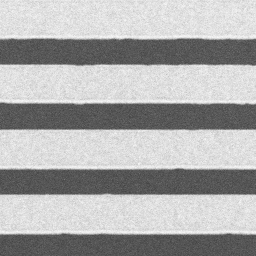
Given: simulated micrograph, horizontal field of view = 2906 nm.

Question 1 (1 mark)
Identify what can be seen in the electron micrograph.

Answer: lines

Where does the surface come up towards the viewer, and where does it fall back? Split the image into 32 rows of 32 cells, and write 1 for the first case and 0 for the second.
11111111111111111111111111111111
11111111111111111111111111111111
11111111111111111111111111111111
11111111111111111111111111111111
11111111111111111111111111111111
00000000000000000000000000000000
00000000000000000000000000000000
00000000000000000000000000000000
11111111111111111111111111111111
11111111111111111111111111111111
11111111111111111111111111111111
11111111111111111111111111111111
11111111111111111111111111111111
00000000000000000000000000000000
00000000000000000000000000000000
00000000000000000000000000000000
11111111111111111111111111111111
11111111111111111111111111111111
11111111111111111111111111111111
11111111111111111111111111111111
11111111111111111111111111111111
00000000000000000000000000000000
00000000000000000000000000000000
00000000000000000000000000000000
11111111111111111111111111111111
11111111111111111111111111111111
11111111111111111111111111111111
11111111111111111111111111111111
11111111111111111111111111111111
00000000000000000000000000000000
00000000000000000000000000000000
00000000000000000000000000000000